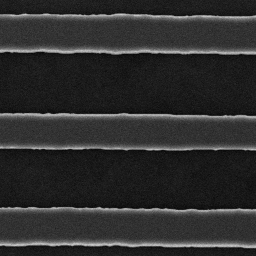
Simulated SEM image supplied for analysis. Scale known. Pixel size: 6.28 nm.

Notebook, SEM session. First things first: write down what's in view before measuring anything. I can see lines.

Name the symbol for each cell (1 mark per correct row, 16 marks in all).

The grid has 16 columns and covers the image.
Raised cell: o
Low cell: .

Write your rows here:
................
oooooooooooooooo
oooooooooooooooo
................
................
................
................
oooooooooooooooo
oooooooooooooooo
................
................
................
................
oooooooooooooooo
oooooooooooooooo
................